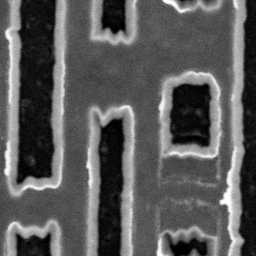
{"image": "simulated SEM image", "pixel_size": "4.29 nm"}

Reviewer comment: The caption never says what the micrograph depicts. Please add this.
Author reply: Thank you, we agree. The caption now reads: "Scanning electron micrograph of one or a few lines or trenches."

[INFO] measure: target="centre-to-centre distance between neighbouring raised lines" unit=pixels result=74.8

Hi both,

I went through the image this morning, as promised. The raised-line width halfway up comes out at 156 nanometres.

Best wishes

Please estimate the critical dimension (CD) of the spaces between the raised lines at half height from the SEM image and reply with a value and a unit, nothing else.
0.184 micrometres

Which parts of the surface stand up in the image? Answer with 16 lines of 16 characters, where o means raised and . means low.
o...oo..ooooooo.
o...oo..ooooooo.
o...ooooooooooo.
o...ooooooooooo.
o...ooooooooooo.
o...ooooooo..oo.
o...oooooo...oo.
o...oo..oo...oo.
o...oo..oo...oo.
o...oo..ooooooo.
o...oo..ooooooo.
o.oooo..ooooooo.
oooooo..ooooooo.
oooooo..ooooooo.
o.oooo..ooooooo.
o..ooo..oo...oo.